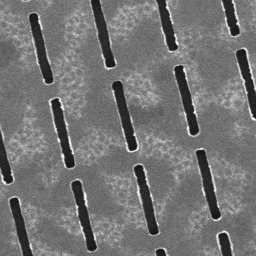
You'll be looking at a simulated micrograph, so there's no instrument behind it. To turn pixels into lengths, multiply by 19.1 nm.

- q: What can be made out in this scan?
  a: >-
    holes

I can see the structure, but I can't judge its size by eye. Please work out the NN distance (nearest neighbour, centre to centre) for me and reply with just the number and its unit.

63.9 pixels